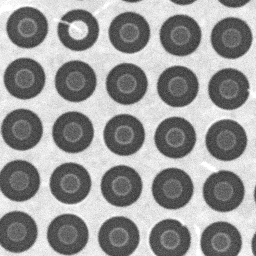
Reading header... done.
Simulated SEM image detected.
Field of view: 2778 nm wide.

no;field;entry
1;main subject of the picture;an array of small figures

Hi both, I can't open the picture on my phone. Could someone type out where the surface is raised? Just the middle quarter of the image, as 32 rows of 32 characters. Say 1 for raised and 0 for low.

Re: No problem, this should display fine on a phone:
00000001111110000001111111100011
00000001111100000000111110000000
00110000111000000000111100000000
01111000111000111000011100001000
01111000110000111100011000011100
01111000110000111100011000111110
00000000111000111000011000111110
00000001111000000000111000011100
00000011111100000000111100000000
11001111111110000001111110000000
11111111111111111111111111000001
11111111111111111111111111111111
00000111111111001111111111111111
00000011111100000011111111000011
00000001111000000001111100000000
01110001110000000000111000000000
11110000110001111000111000011000
11110000110001111000110000111100
01110001110001111000110000111100
00000001110000110000111000111100
00000011110000000000111000000000
00000111111000000001111000000000
11111111111110000111111100000001
11111111111111111111111111000111
10111111111111111111111111111111
00000111111100001111111111111111
00000011111000000011111100000011
00000011110000000001111000000001
11100001100000100001111000000000
11110001100001110000110000111000
11110001100011111000110001111000
11100001100001110000110001111000